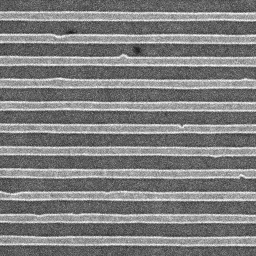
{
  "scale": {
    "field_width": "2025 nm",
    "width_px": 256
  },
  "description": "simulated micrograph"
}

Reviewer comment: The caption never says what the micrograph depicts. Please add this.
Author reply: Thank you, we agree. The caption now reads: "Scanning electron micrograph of parallel lines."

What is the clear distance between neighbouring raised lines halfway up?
114 nm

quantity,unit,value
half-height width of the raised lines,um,0.0603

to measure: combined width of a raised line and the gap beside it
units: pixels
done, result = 22.5